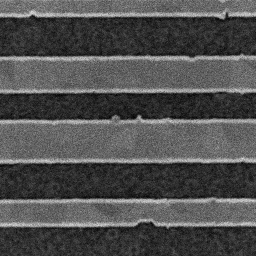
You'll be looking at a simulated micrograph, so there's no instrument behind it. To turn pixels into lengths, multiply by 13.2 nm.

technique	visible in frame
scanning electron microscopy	one or a few lines or trenches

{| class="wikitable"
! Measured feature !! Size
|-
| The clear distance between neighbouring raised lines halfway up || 532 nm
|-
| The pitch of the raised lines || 0.915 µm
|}